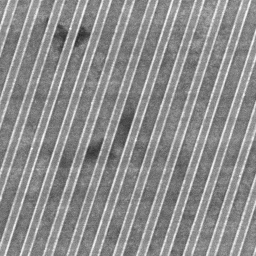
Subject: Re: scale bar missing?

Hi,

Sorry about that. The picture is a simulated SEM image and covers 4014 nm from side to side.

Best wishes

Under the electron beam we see parallel lines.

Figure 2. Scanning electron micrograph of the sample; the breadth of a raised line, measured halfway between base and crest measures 140 nanometres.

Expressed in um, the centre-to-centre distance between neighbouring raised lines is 0.348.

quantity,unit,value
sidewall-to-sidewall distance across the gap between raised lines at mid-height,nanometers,211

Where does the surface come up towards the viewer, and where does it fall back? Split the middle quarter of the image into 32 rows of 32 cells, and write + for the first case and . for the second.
+...++....++....++....++...+++..
....++....++....++...+++...+++..
...+++...+++...+++...++....++...
...+++...++....++....++....++...
...++....++....++...+++...+++...
...++...+++...+++...++....++....
..+++...++....++....++....++...+
..++....++....++....++...+++...+
..++...+++...+++...++....++....+
.+++...++....++....++....++...++
.++....++....++....++...+++...++
.++...+++...+++...++....++....++
+++...+++...++....++....++....++
++....++....++....++...+++...+++
++....++...+++...++....++....++.
++...+++...++....++....++....++.
+....++....++....++...+++...+++.
+....++...+++...++....++....++..
+...+++...++....++....++....++..
....++....++...+++...+++...+++..
....++...+++...++....++....++...
...+++...+++...++....++....++...
...++....++...+++...+++...+++...
...++....++...+++...++....++....
..+++...+++...++....++....++....
..++....++....++...+++...+++...+
..++....++...+++...++....++....+
.+++...+++...++....++....++....+
.++....++....++...+++...+++...++
.++....++...+++...++....++....++
+++...+++...++....++....++....++
++....++....++...+++...+++...+++